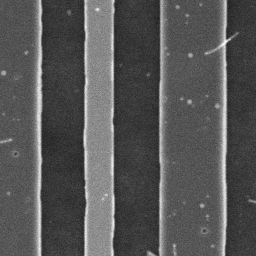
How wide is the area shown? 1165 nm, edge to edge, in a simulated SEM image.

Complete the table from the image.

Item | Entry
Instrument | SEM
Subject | lines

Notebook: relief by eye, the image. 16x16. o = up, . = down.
ooo..oo...oooo..
ooo..oo...oooo..
ooo..oo...oooo..
ooo..oo...oooo..
ooo..oo...oooo..
ooo..oo...oooo..
ooo..oo...oooo..
ooo..oo...oooo..
ooo..oo...oooo..
ooo..oo...oooo..
ooo..oo...oooo..
ooo..oo...oooo..
ooo..oo...oooo..
ooo..oo...oooo..
ooo..oo...oooo..
ooo..oo...oooo..